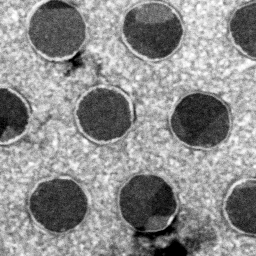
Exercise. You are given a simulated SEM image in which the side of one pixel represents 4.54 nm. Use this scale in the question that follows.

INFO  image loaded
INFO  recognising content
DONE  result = raised bodies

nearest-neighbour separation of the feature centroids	438	nm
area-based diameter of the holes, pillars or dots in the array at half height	268	nm